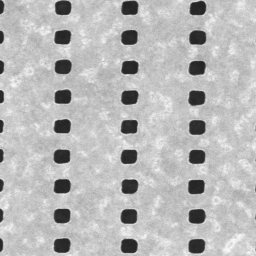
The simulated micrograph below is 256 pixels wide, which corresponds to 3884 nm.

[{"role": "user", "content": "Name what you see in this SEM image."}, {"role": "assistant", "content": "a regular array of holes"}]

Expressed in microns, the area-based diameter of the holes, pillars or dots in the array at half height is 0.253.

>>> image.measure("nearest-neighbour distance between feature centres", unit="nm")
447